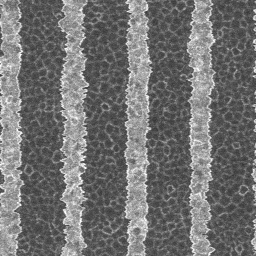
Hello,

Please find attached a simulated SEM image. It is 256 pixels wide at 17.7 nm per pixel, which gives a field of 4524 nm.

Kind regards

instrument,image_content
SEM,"one or a few lines or trenches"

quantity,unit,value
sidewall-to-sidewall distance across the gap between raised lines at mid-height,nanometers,793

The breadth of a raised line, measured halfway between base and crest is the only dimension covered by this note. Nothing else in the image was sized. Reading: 18.1 pixels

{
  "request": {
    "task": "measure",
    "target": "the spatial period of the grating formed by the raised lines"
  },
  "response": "1.12 microns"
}